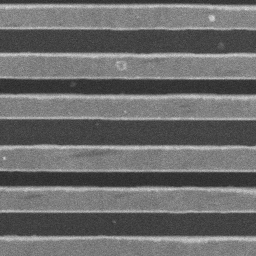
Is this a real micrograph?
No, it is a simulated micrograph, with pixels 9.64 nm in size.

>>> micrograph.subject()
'lines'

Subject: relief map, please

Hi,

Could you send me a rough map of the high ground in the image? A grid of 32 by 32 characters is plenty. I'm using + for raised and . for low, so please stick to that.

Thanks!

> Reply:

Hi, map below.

................................
++++++++++++++++++++++++++++++++
++++++++++++++++++++++++++++++++
++++++++++++++++++++++++++++++++
................................
................................
................................
++++++++++++++++++++++++++++++++
++++++++++++++++++++++++++++++++
++++++++++++++++++++++++++++++++
................................
................................
++++++++++++++++++++++++++++++++
++++++++++++++++++++++++++++++++
++++++++++++++++++++++++++++++++
................................
................................
................................
++++++++++++++++++++++++++++++++
++++++++++++++++++++++++++++++++
++++++++++++++++++++++++++++++++
................................
................................
++++++++++++++++++++++++++++++..
++++++++++++++++++++++++++++++++
++++++++++++++++++++++++++++++++
++++++++++++++++++++++++++++++++
................................
................................
................................
++++++++++++++++++++++++++++++++
++++++++++++++++++++++++++++++++